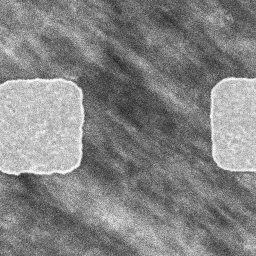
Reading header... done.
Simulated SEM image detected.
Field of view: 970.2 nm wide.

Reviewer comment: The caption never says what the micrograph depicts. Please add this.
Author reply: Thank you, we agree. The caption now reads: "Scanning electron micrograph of raised bodies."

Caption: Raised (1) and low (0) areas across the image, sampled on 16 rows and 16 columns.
0000000000000000
0000000000000000
0000000000000000
0000000000000000
0000000000000000
1111100000000111
1111100000000111
1111100000000111
1111100000000111
1111100000000111
1111100000000011
0000000000000000
0000000000000000
0000000000000000
0000000000000000
0000000000000000